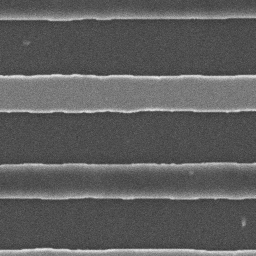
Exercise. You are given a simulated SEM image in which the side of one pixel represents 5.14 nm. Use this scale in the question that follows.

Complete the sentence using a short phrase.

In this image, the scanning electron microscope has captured lines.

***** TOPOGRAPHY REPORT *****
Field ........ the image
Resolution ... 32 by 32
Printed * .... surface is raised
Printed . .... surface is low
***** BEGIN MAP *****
********************************
********************************
......***.......................
................................
................................
................................
................................
................................
................................
*.*.********.****.....****....**
********************************
********************************
********************************
********************************
................................
................................
................................
................................
................................
................................
.........................*****.*
********************************
********************************
********************************
********************************
................................
................................
................................
................................
................................
................................
********************************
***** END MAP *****